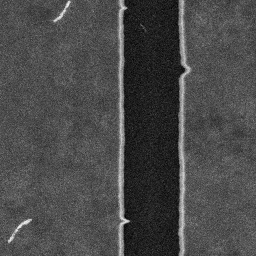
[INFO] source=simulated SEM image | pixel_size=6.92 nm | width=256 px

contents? one or a few lines or trenches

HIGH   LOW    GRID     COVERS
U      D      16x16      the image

UUUUUUUUDDDUUUUU
UUUUUUUUDDDUUUUU
UUUUUUUUDDDUUUUU
UUUUUUUUDDDUUUUU
UUUUUUUUDDDDUUUU
UUUUUUUUDDDUUUUU
UUUUUUUUDDDUUUUU
UUUUUUUUDDDUUUUU
UUUUUUUUDDDUUUUU
UUUUUUUUDDDUUUUU
UUUUUUUUDDDUUUUU
UUUUUUUUDDDUUUUU
UUUUUUUUDDDUUUUU
UUUUUUUUDDDUUUUU
UUUUUUUUDDDUUUUU
UUUUUUUUDDDUUUUU